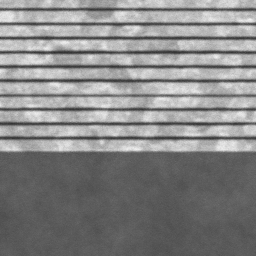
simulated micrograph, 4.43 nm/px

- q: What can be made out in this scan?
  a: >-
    parallel lines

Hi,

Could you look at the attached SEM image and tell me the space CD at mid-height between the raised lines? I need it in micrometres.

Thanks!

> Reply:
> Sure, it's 0.015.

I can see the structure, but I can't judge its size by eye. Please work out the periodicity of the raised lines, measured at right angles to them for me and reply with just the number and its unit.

63.4 nanometers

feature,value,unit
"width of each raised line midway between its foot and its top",48.8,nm